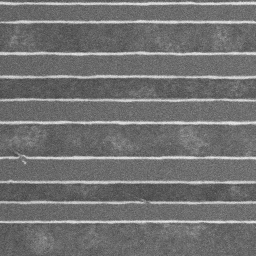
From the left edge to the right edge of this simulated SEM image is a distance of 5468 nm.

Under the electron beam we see parallel lines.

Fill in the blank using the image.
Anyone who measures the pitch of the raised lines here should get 1070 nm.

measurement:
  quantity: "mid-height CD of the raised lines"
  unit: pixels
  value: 22.4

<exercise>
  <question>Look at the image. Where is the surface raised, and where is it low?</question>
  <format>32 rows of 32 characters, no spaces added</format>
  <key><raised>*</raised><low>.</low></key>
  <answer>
*..**.................***...****
********************************
********************************
................................
................................
................................
................................
********************************
********************************
*************.**...*************
................................
................................
....*...........................
********************************
********************************
................................
................................
................................
................................
..*.............................
********************************
********************************
********************************
................................
................................
********************************
********************************
********************************
................................
................................
................................
................................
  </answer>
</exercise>